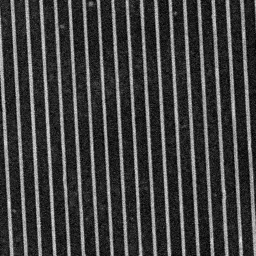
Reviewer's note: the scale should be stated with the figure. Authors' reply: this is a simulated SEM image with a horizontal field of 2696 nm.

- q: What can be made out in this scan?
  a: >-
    parallel lines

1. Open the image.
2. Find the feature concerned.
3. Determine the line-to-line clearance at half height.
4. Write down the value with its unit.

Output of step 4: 0.123 um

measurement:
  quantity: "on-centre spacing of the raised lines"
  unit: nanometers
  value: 151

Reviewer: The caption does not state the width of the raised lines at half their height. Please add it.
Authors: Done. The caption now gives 27.6 nanometers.